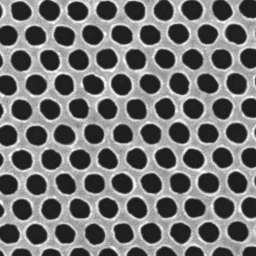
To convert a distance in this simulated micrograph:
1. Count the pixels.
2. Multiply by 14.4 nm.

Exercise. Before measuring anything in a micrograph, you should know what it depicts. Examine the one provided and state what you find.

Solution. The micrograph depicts a regular array of holes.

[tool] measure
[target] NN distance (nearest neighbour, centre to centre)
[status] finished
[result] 404 nm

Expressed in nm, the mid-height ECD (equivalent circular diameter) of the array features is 306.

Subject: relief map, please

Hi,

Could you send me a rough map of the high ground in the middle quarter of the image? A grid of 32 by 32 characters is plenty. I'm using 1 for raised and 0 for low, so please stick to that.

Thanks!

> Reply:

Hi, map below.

11000011100001110000111100001100
11100111111111111001111111111111
01111101111110011111011111100011
00111000011100001110000111100001
00110000001100000110000011000001
00111000001100000110000011000001
00111000001100000111000011100001
01111100011110001111100111110001
11101111110111111111111110111110
11000011100011110000111000011100
10000011000001100000111000001100
10000011000001100000011000001100
11000011100001110000011000001100
11100011110001110000111100011110
11111111111111111111111111110111
01111100011110001111000111000001
00111000001100000110000011000001
00011000001100000110000011000001
00011000001100000111000011100001
00111100011110000111000011110001
11111111111111111111111111111111
11100111100011111000111000011110
11000011100001110000111000001100
10000001000001110000011000001100
10000001100000110000011000001100
11000011100001111000111100001110
11111111111011111101111111111111
01111110111111011111000111100011
00111000001100000110000011100001
00011000001100000110000011000000
00011000001100000110000001100000
00011000001100000111000011100001